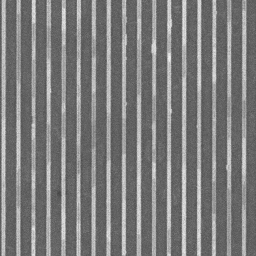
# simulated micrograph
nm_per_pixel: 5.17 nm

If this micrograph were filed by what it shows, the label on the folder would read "parallel lines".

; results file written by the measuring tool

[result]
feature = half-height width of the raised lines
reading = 14.2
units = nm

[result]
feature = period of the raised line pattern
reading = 77.8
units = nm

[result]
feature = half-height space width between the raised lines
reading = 62.1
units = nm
